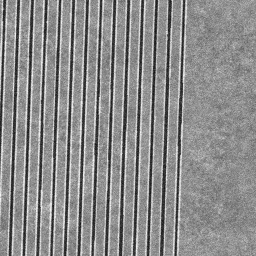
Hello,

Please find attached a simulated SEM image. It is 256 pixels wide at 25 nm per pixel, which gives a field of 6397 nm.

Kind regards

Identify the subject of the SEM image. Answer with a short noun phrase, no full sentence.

parallel lines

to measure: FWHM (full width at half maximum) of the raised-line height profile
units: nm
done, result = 240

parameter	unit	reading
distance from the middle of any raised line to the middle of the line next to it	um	0.344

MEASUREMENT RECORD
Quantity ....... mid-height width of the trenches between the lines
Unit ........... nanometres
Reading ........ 109